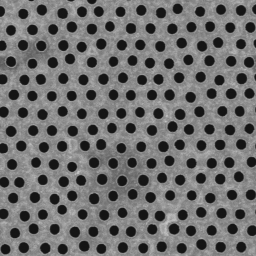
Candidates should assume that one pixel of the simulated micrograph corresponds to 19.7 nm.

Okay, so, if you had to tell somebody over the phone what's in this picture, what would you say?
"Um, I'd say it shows a regular array of holes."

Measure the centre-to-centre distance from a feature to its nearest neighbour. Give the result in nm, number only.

347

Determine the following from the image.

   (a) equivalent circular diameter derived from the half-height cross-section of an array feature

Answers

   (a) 202 nm